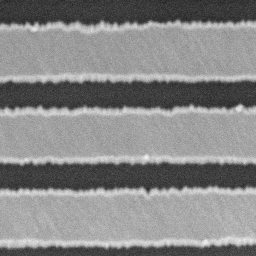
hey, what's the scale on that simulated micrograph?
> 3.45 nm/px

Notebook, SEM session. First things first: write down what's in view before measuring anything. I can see lines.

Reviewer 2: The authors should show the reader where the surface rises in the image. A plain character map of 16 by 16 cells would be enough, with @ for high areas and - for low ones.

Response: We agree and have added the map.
----------------
---------@@@@@@@
@@@@@@@@@@@@@@@@
@@@@@@@@@@@@@@@@
@@@@@@@@@@@@@@@@
----------------
----------------
@@@@@@@@@@@@@@@@
@@@@@@@@@@@@@@@@
@@@@@@@@@@@@@@@@
----------------
----------------
@@@@@@@@@@@@@@@@
@@@@@@@@@@@@@@@@
@@@@@@@@@@@@@@@@
----------------